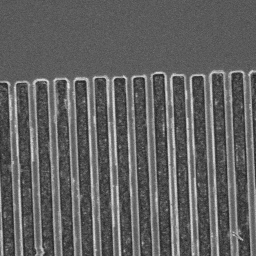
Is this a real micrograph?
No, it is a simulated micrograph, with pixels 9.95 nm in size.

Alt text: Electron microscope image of parallel lines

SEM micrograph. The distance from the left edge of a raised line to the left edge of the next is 0.195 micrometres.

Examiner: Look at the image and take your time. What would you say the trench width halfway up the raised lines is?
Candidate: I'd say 13.2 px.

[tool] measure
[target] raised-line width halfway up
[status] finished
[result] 65.9 nanometres